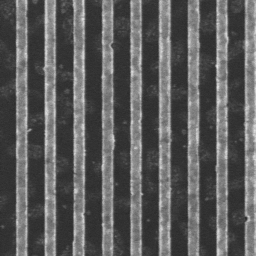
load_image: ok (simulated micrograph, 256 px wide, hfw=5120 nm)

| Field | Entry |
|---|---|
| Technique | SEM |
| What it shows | parallel lines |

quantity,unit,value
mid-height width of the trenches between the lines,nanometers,395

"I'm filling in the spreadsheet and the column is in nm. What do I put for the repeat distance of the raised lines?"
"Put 573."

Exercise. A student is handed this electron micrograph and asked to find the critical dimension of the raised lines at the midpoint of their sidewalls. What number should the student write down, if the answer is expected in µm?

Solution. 0.188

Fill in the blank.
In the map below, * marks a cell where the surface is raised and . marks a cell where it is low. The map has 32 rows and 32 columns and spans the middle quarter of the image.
...**.....**.....**.....**.....*
...**.....**.....**.....**.....*
...**.....**.....**.....**.....*
...**.....**.....**.....**.....*
...**.....**.....**.....**.....*
...**.....**.....**.....**.....*
...**.....**.....**.....**.....*
...**.....**.....**.....**.....*
...**.....**.....**.....**.....*
...**.....**.....**.....**.....*
...**.....**.....**.....**.....*
...**.....**.....**.....**.....*
...**.....**.....**.....**.....*
...**.....**.....**.....**.....*
...**.....**.....**.....**.....*
...**.....**.....**.....**.....*
...**.....**.....**.....**.....*
...**.....**.....**.....**.....*
...**.....**.....**.....**.....*
...**.....**.....**.....**.....*
...**.....**.....**.....**.....*
...**.....**.....**.....**.....*
...**.....**.....**.....**.....*
...**.....**.....**.....**.....*
...**.....**.....**.....**.....*
...**.....**.....**.....**.....*
...**.....**.....**.....**.....*
...**.....**.....**.....**.....*
...**.....**.....**.....**.....*
...**.....**.....**.....**.....*
...**.....**.....**.....**.....*
...**.....**.....**.....***....*